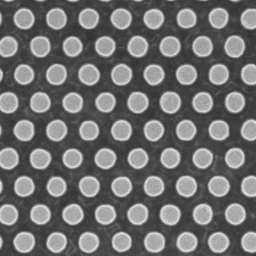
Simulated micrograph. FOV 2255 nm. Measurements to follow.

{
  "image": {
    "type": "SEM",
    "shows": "a regular array of raised bodies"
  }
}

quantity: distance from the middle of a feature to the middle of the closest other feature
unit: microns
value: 0.283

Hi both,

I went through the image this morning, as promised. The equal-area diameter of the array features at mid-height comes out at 0.184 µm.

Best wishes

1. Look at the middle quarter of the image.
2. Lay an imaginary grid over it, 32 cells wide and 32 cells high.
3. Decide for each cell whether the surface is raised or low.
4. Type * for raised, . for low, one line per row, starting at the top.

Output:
.....***.....***.....***.....***
*...*****...*****...*****...****
*...*****...*****...*****...****
*...*****...*****...*****...****
....****....****.....***.....***
................................
................................
.**......***.....***.....***....
*****...*****...*****...*****...
*****...*****...*****...*****...
*****...*****...*****...*****...
****.....***.....***.....***....
................................
................................
.....**......***.....***.....***
*...****....*****...*****...****
*...*****...*****...*****...****
*...*****...*****...*****...****
....****.....***.....***.....***
................................
................................
.**......***.....***.....***....
****....*****...*****...*****...
*****...*****...*****...*****...
****....*****...*****...*****...
.***.....***.....***.....***....
................................
................................
.....***.....***.....***.....***
....*****...*****...*****...****
*...*****...*****...*****...****
....*****...*****...*****...****